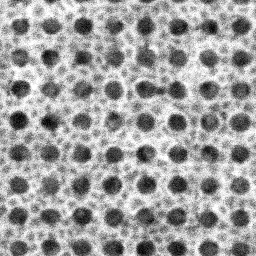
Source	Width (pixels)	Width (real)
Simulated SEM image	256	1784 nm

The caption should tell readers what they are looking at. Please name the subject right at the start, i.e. a regular array of raised bodies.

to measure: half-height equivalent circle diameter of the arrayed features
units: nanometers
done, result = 131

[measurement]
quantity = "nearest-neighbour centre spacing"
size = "23 px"